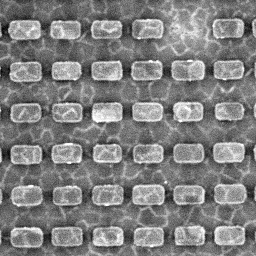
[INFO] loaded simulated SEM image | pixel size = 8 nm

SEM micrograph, a regular array of raised bodies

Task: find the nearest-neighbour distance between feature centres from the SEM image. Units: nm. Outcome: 323